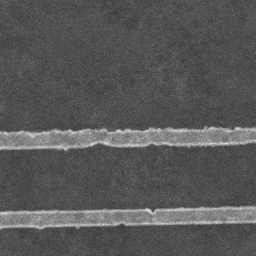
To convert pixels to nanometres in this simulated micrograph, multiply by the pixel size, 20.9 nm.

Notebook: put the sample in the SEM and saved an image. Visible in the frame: one or a few lines or trenches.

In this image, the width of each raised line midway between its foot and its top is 13.6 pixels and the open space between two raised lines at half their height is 1370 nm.